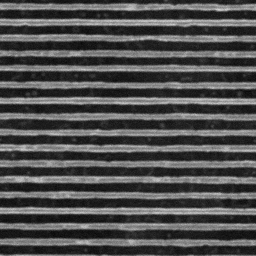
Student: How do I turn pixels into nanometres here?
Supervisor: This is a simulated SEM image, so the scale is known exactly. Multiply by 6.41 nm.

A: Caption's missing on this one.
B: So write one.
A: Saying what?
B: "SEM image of parallel lines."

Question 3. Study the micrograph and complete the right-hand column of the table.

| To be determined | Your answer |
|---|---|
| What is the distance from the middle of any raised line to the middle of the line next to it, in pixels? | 15.7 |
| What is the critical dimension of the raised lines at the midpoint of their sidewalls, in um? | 0.0312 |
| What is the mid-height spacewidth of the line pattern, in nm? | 69.7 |